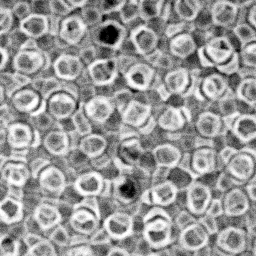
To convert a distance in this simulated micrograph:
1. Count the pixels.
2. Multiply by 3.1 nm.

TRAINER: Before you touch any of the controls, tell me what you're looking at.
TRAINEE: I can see a regular array of raised bodies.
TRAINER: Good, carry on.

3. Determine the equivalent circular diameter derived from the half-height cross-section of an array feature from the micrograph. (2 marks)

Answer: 72.1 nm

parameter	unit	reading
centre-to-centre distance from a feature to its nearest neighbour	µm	0.106